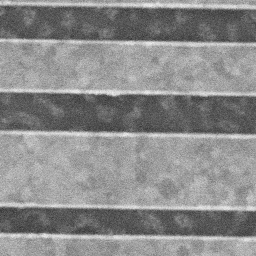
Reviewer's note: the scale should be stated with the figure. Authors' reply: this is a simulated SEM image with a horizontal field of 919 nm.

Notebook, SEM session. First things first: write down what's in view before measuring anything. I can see one or a few lines or trenches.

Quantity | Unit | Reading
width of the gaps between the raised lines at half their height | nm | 132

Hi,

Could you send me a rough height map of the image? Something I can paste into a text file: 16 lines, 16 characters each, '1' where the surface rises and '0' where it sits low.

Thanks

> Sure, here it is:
0000000000000001
0000000000000000
0000000000000000
1111111111111111
1111111111111111
1111111111111111
0000000000000000
0000000000000000
1111111111100000
1111111111111111
1111111111111111
1111111111111111
1111111111111111
0000000000000000
0000000000000000
1111111111111111